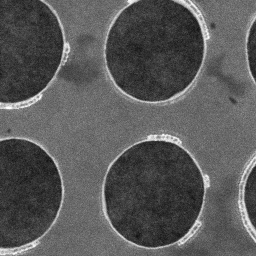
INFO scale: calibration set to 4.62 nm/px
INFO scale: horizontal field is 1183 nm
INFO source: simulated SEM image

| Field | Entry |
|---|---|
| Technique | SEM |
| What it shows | holes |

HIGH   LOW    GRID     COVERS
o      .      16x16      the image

...ooooo....oooo
....ooo.....oooo
....ooo......oo.
....ooo......oo.
...oooo.....oooo
...ooooo....oooo
oooooooooooooooo
oooooooooooooooo
oooooooooooooooo
...ooooo....oooo
....ooo.....oooo
....ooo......oo.
....oo.......oo.
....ooo.....oooo
...oooo.....oooo
.ooooooooooooooo